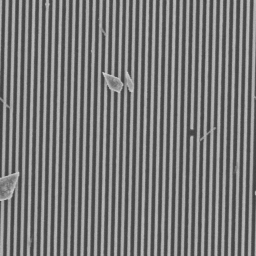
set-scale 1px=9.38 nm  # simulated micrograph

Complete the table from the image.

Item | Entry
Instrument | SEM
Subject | parallel lines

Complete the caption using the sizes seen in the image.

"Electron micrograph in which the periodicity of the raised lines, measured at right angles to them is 62.9 nanometres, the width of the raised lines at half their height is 0.0246 µm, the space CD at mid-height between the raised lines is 3.62 px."